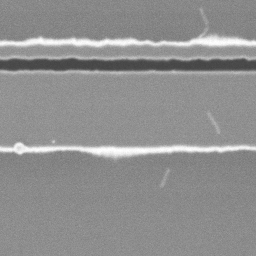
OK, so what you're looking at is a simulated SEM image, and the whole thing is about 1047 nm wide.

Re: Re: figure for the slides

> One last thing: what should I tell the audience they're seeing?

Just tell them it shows lines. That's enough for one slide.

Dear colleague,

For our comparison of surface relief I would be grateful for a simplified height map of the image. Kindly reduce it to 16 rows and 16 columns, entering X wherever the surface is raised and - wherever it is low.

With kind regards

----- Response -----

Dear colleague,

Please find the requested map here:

----------------
----------------
----------------
XXXXXXXXXXXXXXXX
XXXXXXXXXXXXXXXX
XXXXXXXXXXXXXXXX
XXXXXXXXXXXXXXXX
XXXXXXXXXXXXXXXX
XXXXXXXXXXXXXXXX
----------------
----------------
----------------
----------------
----------------
----------------
----------------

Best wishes